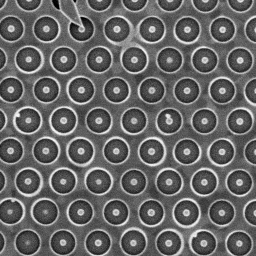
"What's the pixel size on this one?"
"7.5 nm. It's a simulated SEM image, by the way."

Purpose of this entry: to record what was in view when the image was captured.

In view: an array of small figures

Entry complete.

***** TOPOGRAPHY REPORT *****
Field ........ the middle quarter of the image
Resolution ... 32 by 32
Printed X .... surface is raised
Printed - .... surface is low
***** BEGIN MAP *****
---XXX-----XXXX------XXX-----XXX
--XXXXX----XXXXX----XXXXX---XXXX
XXXXXXXXXXXXXXXXXXXXXXXXXXXXXXXX
XXX--XXXXXXXX-XXXXXXX-XXXXXXXX-X
X------XXXX-----XXXX----XXXXX---
X------XXX------XXX------XXX----
X-------XX------XXX------XXX----
X------XXX------XXX------XXX----
XX-----XXXX-----XXX------XXX----
XXX---XXXXXX--XXXXXXX--XXXXXX---
XXXXXXXXXXXXXXXXXXXXXXXXXXXXXXXX
--XXXXX---XXXXXX---XXXXXX---XXXX
---XXX-----XXXX-----XXXX-----XXX
---XXX------XXX------XX------XXX
---XXX------XX-------XX-------XX
---XXX------XXX-----XXX------XXX
--XXXXX----XXXX-----XXXX-----XXX
XXXXXXXXXXXXXXXXX-XXXXXXX-XXXXXX
XXX-XXXXXXXXX-XXXXXXXX-XXXXXXXXX
XX-----XXXX----XXXXX----XXXXX---
X------XXX------XXX------XXX----
X------XXX------XXX------XX-----
X------XXX------XXX------XX-----
X------XXX------XXX------XXX----
XX----XXXXX----XXXXX----XXXXX---
XXXXXXXXXXXXXXXXXXXXXXXXXXXXXXXX
--XXXXX---XXXXXXX-XXXXXXX--XXXXX
---XXX-----XXXX-----XXXX-----XXX
---XX-------XX------XXX------XXX
---XX-------XX-------XX-------XX
---XXX------XX------XXX------XXX
--XXXX-----XXXX-----XXXX-----XXX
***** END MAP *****